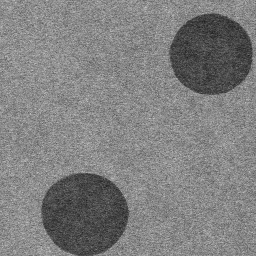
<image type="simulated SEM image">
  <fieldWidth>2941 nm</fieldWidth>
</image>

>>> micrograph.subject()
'holes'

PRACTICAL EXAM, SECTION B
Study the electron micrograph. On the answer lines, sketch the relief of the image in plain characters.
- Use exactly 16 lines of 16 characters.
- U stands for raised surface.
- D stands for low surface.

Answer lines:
UUUUUUUUUUUUUUUU
UUUUUUUUUUUUDDDU
UUUUUUUUUUUDDDDD
UUUUUUUUUUUDDDDD
UUUUUUUUUUUDDDDD
UUUUUUUUUUUUDDDU
UUUUUUUUUUUUUUUU
UUUUUUUUUUUUUUUU
UUUUUUUUUUUUUUUU
UUUUUUUUUUUUUUUU
UUUUUUUUUUUUUUUU
UUUDDDDUUUUUUUUU
UUUDDDDDUUUUUUUU
UUUDDDDDUUUUUUUU
UUUDDDDDUUUUUUUU
UUUUDDDUUUUUUUUU